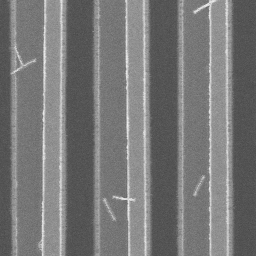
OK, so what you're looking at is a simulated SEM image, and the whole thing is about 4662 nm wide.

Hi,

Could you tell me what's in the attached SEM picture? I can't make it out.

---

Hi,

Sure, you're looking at lines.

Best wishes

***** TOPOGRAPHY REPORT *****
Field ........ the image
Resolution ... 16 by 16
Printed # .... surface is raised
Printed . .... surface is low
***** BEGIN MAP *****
.###..###..###..
.###..###..###..
.###..###..###..
.###..###..###..
.###..###..###..
.###..###..###..
.###..###..###..
.###..###..###..
.###..###..###..
.###..###..###..
.###..###..###..
.###..###..###..
.###..###..###..
.###..###..###..
.###..###..###..
.###..###..###..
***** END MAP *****